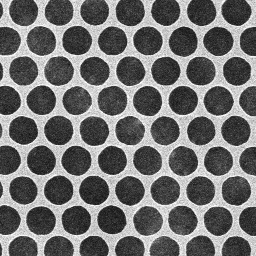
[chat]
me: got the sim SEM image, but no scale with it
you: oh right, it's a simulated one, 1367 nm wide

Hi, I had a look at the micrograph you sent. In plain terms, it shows a regular array of holes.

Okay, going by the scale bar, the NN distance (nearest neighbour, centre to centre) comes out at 0.184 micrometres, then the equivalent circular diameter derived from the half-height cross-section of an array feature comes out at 159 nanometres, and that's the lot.